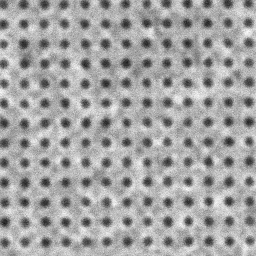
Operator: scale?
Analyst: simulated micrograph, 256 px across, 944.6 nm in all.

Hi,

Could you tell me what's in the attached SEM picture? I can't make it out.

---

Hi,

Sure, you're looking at a regular array of holes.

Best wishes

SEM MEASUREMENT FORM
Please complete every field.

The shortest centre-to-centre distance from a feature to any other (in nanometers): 72.5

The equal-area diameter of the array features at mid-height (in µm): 0.0416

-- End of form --